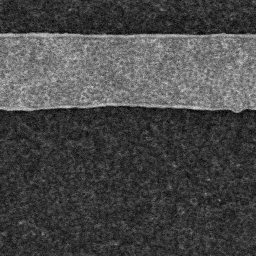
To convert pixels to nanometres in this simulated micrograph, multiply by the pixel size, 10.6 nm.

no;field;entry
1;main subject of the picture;one or a few lines or trenches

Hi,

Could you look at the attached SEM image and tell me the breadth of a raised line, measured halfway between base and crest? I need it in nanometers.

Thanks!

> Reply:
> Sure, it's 763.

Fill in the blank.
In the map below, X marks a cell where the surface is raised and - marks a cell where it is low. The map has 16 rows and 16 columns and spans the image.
----------------
----------------
XXXXXXXXXXXXXXXX
XXXXXXXXXXXXXXXX
XXXXXXXXXXXXXXXX
XXXXXXXXXXXXXXXX
XXXXXXXXXXXXXXXX
----------------
----------------
----------------
----------------
----------------
----------------
----------------
----------------
----------------